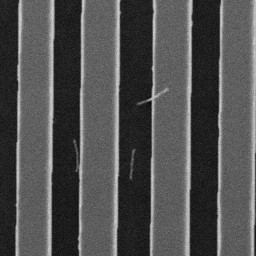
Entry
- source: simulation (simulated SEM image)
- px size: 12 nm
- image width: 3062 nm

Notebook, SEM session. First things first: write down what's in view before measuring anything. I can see lines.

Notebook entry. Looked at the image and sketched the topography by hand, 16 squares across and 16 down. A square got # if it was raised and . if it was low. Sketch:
.##..##...##..##
.##..##...##..##
.##..##...##..##
.##..##...##..##
.##..##...##..##
.##..##...##..##
.##..##..###..##
.##..##...##..##
.##..##...##..##
.##..##...##..##
.##..##..###..##
.##..##..###..##
.##..##..###..##
.##..##..###..##
.##..##..###..##
.##..##..###..##